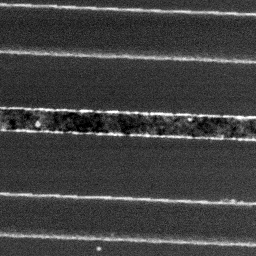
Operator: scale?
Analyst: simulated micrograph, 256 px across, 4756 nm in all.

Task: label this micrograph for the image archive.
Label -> lines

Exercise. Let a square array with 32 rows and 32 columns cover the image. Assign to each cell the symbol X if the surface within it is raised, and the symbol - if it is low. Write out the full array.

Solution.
--------------------------------
XXXXXXXXXXXXXXXXXXXXXX----------
XXXXXXXXXXXXXXXXXXXXXXXXXXXXXXXX
XXXXXXXXXXXXXXXXXXXXXXXXXXXXXXXX
XXXXXXXXXXXXXXXXXXXXXXXXXXXXXXXX
XXXXXXXXXXXXXXXXXXXXXXXXXXXXXXXX
---XXXXXXXXXXXXXXXXXXXXXXXXXXXXX
----------------------------XXXX
--------------------------------
--------------------------------
--------------------------------
--------------------------------
--------------------------------
X-------------------------------
XXXXXXXXXXXXXXXXXXXXXXXXX-------
XXXXXXXXXXXXXXXXXXXXXXXXXXXXXXXX
-------XXXXXXXXXXXXXXXXXXXXXXXXX
--------------------------------
--------------------------------
--------------------------------
--------------------------------
--------------------------------
--------------------------------
--------------------------------
XXXXXXX-------------------------
XXXXXXXXXXXXXXXXXXXXXXXXXXXXXXXX
XXXXXXXXXXXXXXXXXXXXXXXXXXXXXXXX
XXXXXXXXXXXXXXXXXXXXXXXXXXXXXXXX
XXXXXXXXXXXXXXXXXXXXXXXXXXXXXXXX
-----XXXXXXXXXXXXXXXXXXXXXXXXXXX
-------------------------------X
--------------------------------